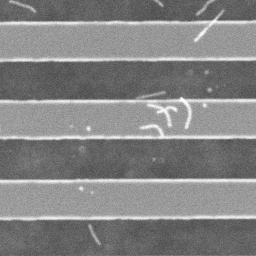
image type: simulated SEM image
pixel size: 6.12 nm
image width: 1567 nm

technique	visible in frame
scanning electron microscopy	lines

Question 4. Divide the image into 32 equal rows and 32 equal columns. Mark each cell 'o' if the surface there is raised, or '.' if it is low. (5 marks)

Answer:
................................
................................
................................
oooooooooooooooooooooooooooooooo
oooooooooooooooooooooooooooooooo
oooooooooooooooooooooooooooooooo
oooooooooooooooooooooooooooooooo
ooooooooooooo...................
................................
................................
................................
................................
......................oooooooooo
oooooooooooooooooooooooooooooooo
oooooooooooooooooooooooooooooooo
oooooooooooooooooooooooooooooooo
oooooooooooooooooooooooooooooooo
................................
................................
................................
................................
................................
.........ooooooooooooooooooooooo
oooooooooooooooooooooooooooooooo
oooooooooooooooooooooooooooooooo
oooooooooooooooooooooooooooooooo
oooooooooooooooooooooooooooooooo
................................
................................
................................
................................
................................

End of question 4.